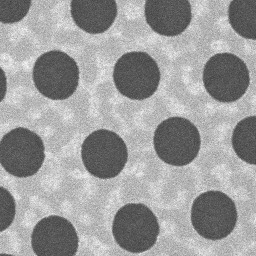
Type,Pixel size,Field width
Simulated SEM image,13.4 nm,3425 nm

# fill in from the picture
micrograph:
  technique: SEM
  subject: holes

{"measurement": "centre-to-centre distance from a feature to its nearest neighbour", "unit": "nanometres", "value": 1060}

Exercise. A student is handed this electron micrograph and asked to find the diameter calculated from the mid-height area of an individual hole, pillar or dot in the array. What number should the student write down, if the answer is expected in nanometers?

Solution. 655